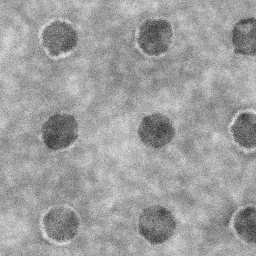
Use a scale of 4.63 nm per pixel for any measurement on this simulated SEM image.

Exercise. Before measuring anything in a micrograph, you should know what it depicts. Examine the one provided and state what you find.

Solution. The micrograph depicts raised bodies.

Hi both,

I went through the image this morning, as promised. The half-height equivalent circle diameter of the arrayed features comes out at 187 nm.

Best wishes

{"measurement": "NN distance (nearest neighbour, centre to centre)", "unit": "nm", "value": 432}